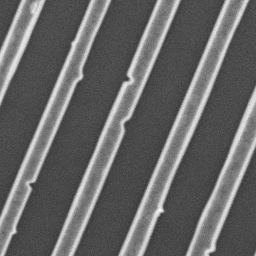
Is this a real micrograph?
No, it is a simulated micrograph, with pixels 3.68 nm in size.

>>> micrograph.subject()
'one or a few lines or trenches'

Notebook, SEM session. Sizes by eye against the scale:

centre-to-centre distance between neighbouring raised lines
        230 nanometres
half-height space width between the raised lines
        164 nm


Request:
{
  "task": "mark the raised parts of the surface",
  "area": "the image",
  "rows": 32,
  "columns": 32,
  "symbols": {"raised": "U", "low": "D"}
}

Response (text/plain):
DDDUUDDDDDDUUDDDDDDDUUDDDDDDUUUD
DDUUUDDDDDDUUDDDDDDUUUDDDDDDUUDD
DDUUDDDDDDDUUDDDDDDUUDDDDDDUUUDD
DUUUDDDDDDUUDDDDDDUUUDDDDDDUUDDD
DUUUDDDDDDUUDDDDDDUUUDDDDDUUUDDD
DUUDDDDDDUUDDDDDDDUUDDDDDDUUDDDD
UUUDDDDDDUUDDDDDDUUUDDDDDDUUDDDD
UUDDDDDDUUUDDDDDDUUDDDDDDUUUDDDD
UUDDDDDDUUDDDDDDUUUDDDDDDUUDDDDD
UDDDDDDDUUDDDDDDUUDDDDDDDUUDDDDD
UDDDDDDUUDDDDDDDUUDDDDDDUUDDDDDD
DDDDDDDUUDDDDDDUUUDDDDDDUUDDDDDD
DDDDDDUUUDDDDDDUUDDDDDDUUUDDDDDD
DDDDDDUUDDDDDDUUUDDDDDDUUDDDDDDU
DDDDDDUUDDDDDDUUDDDDDDUUUDDDDDDU
DDDDDUUDDDDDDUUDDDDDDDUUDDDDDDUU
DDDDDUUDDDDDDUUDDDDDDUUUDDDDDDUU
DDDDUUDDDDDDDUUDDDDDDUUUDDDDDDUU
DDDDUUDDDDDDUUUDDDDDDUUDDDDDDUUU
DDDUUUDDDDDDUUDDDDDDUUUDDDDDDUUD
DDDUUDDDDDDUUUDDDDDDUUDDDDDDUUUD
DDDUUDDDDDDUUDDDDDDUUUDDDDDDUUDD
DDUUDDDDDDUUUDDDDDDUUDDDDDDUUUDD
DDUUDDDDDDUUDDDDDDDUUDDDDDDUUUDD
DUUDDDDDDDUUDDDDDDUUUDDDDDDUUDDD
DUUDDDDDDUUUDDDDDDUUDDDDDDUUUDDD
UUUDDDDDDUUDDDDDDUUUDDDDDDUUDDDD
UUDDDDDDUUUDDDDDDUUDDDDDDUUUDDDD
UUDDDDDDUUDDDDDDDUUDDDDDDUUDDDDD
UDDDDDDDUUDDDDDDUUUDDDDDUUUDDDDD
UDDDDDDUUUDDDDDDUUDDDDDDUUUDDDDD
DDDDDDDUUDDDDDDUUUDDDDDDUUDDDDDD